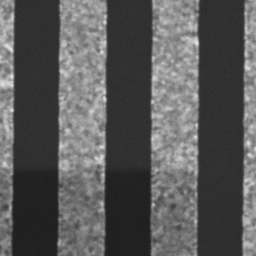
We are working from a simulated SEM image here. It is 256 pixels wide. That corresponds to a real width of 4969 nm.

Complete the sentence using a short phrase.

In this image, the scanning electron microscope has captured wiring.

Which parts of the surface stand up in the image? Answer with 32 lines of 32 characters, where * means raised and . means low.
**......*****......******......*
**......*****......******......*
**......*****......******......*
**......*****......*****.......*
**......*****......******......*
**......*****......******......*
*......******......******......*
*......******......******......*
*.......*****......******......*
*.......*****......******......*
**.....******......******......*
**.....******......******......*
**.....******......******......*
**.....******......******......*
*......******......******......*
*......******......******......*
**......*****......******......*
**......*****......*****.......*
**......*****......*****.......*
**......*****......*****.......*
**.....******......*****.......*
**.....******......*****.......*
*......******......*****.......*
*......******......*****.......*
*......******......*****.......*
*......******......*****.......*
*......******......*****......**
*......******......*****......**
*......******......*****......**
*......******......*****.......*
*......******......*****.......*
*......******......*****.......*